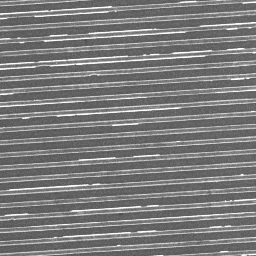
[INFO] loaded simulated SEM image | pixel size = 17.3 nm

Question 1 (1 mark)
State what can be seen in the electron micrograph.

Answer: parallel lines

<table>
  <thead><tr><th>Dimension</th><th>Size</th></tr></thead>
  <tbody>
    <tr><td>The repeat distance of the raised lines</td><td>12.6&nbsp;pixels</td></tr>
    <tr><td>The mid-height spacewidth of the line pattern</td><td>151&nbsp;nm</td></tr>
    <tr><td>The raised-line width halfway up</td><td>73.4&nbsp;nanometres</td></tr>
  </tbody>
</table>